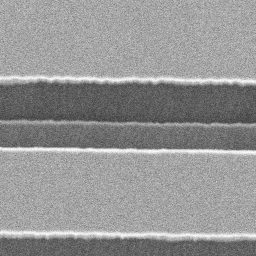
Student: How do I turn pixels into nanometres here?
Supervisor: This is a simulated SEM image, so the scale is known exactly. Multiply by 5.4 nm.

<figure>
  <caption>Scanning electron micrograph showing lines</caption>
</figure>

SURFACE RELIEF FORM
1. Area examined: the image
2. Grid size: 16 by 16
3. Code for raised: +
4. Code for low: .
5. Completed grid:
++++++++++++++++
++++++++++++++++
++++++++++++++++
++++++++++++++++
++++++++++++++++
................
................
................
................
++++++++++++++++
++++++++++++++++
++++++++++++++++
++++++++++++++++
++++++++++++++++
++++++++++++++++
................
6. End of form